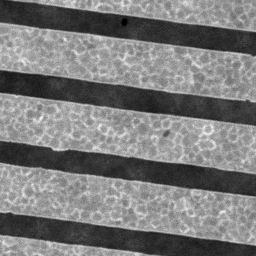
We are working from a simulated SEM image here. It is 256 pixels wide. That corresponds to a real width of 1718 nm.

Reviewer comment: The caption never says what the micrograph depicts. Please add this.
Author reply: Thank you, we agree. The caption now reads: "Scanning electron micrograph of one or a few lines or trenches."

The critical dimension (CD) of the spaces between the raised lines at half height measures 0.165 microns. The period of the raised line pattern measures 471 nm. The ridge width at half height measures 308 nanometres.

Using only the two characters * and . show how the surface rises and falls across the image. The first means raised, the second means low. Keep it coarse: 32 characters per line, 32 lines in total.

......**************************
.............*******************
.....................***********
****.........................***
************....................
********************............
****************************....
********************************
********************************
........************************
...............*****************
.....................***********
******.........................*
**************..................
*********************...........
*****************************...
********************************
********************************
......**************************
................****************
*.......................********
********......................**
***************.................
**********************..........
******************************..
********************************
********************************
........************************
................****************
........................********
********.......................*
****************................